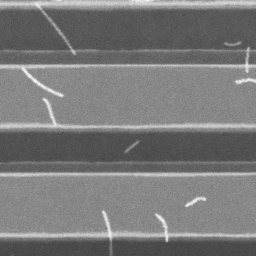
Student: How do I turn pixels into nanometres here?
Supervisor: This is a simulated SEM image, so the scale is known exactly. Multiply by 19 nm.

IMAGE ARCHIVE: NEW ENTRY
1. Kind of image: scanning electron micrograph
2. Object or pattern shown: lines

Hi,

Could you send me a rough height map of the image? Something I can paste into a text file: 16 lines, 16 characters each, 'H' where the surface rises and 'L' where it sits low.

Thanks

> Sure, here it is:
LLLLLLLLLLLLLLLL
LLLLLLLLLLLLLLLL
LLLLLLLLLLLLLLLL
LLLLLLLLLLLLLLLL
HHHHHHHHHHHHHHHH
HHHHHHHHHHHHHHHH
HHHHHHHHHHHHHHHH
HHHHHHHHHHHHHHHH
LLLLLLLLLLLLLLLL
LLLLLLLLLLLLLLLL
LLLLLLLLLLLLLLLL
HHHHHHHHHHHHHHHH
HHHHHHHHHHHHHHHH
HHHHHHHHHHHHHHHH
HHHHHHHHHHHHHHHH
LLLLLLLLLLLLLLLL